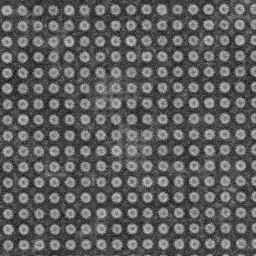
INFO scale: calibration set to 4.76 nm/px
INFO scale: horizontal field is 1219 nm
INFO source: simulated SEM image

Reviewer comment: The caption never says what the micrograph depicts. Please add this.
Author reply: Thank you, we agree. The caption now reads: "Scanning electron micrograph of a regular array of raised bodies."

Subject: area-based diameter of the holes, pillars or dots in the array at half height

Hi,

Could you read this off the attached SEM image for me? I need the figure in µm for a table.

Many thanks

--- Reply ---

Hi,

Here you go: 0.0439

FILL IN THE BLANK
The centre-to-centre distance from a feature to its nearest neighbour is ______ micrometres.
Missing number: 0.0722